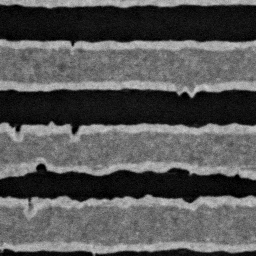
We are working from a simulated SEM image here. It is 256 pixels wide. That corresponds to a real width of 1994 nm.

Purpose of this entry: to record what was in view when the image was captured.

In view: one or a few lines or trenches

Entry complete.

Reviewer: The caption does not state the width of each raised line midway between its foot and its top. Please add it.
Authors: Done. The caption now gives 342 nanometers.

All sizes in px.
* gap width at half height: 41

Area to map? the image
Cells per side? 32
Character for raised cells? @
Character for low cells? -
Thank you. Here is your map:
--------------------------------
--------------------------------
--------------------------------
--------------------------------
--------------------------------
@------@---------@-----@-------@
@@@@@@@@@@@@@@@@@@@@@@@@@@@@@@@@
@@@@@@@@@@@@@@@@@@@@@@@@@@@@@@@@
@@@@@@@@@@@@@@@@@@@@@@@@@@@@@@@@
@@@@@@@@@@@@@@@@@@@@@@@@@@@@@@@@
@@@@@@@@@@@@@@@@@@@@@@@@@@@@@@@@
----------------------@@--------
--------------------------------
--------------------------------
--------------------------------
--------------------------------
@@-@@@@@@-@@@@@@@@@@@@@@@@@@@@@@
@@@@@@@@@@@@@@@@@@@@@@@@@@@@@@@@
@@@@@@@@@@@@@@@@@@@@@@@@@@@@@@@@
@@@@@@@@@@@@@@@@@@@@@@@@@@@@@@@@
@@@@@-@@@@@@@@@@@@@@@@@@@@@@@@@@
@----------@@---------------@@@@
--------------------------------
--------------------------------
--------------------------------
@@@--@@@@@@@@@@@@@@@@@@-@@@@@@@@
@@@@@@@@@@@@@@@@@@@@@@@@@@@@@@@@
@@@@@@@@@@@@@@@@@@@@@@@@@@@@@@@@
@@@@@@@@@@@@@@@@@@@@@@@@@@@@@@@@
@@@@@@@@@@@@@@@@@@@@@@@@@@@@@@@@
@@@@@@@@@@@@@@@@@@@@@@@@@@@@@@@@
--------------------------------